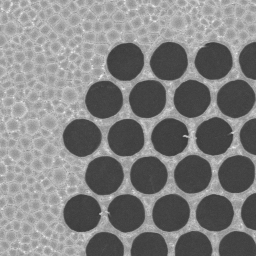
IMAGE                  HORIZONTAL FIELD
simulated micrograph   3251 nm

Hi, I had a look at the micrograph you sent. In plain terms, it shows a regular array of holes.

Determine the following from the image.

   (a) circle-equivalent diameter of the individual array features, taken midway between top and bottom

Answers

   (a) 478 nanometers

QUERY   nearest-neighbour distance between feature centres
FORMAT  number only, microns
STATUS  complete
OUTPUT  0.552